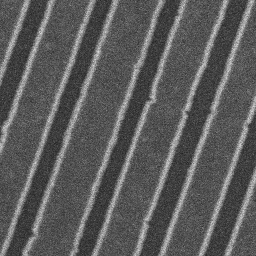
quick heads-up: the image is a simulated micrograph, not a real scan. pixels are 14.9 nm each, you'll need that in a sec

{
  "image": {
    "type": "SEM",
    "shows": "one or a few lines or trenches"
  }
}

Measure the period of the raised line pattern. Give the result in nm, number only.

932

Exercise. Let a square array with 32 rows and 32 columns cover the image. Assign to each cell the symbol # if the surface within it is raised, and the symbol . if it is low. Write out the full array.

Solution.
###...######..######...#####...#
###...#####...######..######...#
###...#####..######...######...#
##...#####...######...#####...##
##...#####...######..######...##
##..######..######...#####...###
#...#####...######...#####...###
#...#####...######..######...###
...######..######...#####...####
...#####...######...#####...####
...#####...######..#####....####
..######..######...#####...#####
..#####...######...#####...#####
..#####...######..######...#####
.######..######...#####...#####.
.#####...######...#####...#####.
######..#######..#####....#####.
######..######...#####...#####..
#####...######..######...#####..
#####..######...#####...######..
#####..######...#####...#####...
####...######..######...#####...
####..######...#####...######...
###...######...#####...#####...#
###...######..######...#####...#
###..######...#####...######...#
##...######...#####...#####...##
##...######..#####....#####...##
##..######...#####...######..###
#...######...#####...#####...###
#...######..######...#####...###
#..######...#####...#####...####